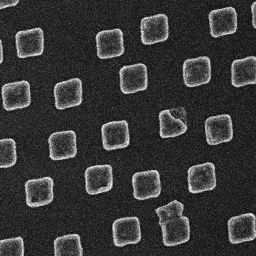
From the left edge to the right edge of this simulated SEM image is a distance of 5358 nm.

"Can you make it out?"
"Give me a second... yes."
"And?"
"a regular array of raised bodies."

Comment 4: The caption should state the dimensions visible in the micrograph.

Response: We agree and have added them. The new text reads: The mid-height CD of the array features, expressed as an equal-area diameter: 607 nm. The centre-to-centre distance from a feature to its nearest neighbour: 1010 nanometres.